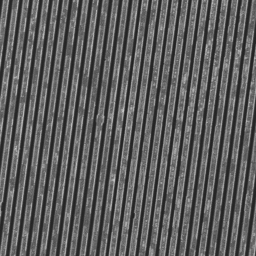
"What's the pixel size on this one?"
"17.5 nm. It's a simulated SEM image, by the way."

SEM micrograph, parallel lines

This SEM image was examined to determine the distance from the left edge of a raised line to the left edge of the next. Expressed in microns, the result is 0.173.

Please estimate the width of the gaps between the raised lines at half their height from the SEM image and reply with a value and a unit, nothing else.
63 nanometers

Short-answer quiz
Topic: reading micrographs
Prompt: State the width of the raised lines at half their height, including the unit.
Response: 111 nm